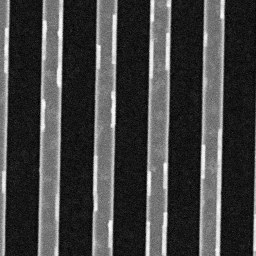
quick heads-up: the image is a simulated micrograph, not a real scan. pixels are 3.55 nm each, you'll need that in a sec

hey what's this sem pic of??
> parallel lines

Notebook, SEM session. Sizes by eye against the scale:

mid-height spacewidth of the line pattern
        0.12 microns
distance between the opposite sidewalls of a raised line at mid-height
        71.1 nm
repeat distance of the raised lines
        191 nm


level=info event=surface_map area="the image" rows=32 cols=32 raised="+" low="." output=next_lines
+....+++....+++....++.....++....
+....+++....+++....++.....++....
+....+++....++.....++.....++....
+....+++....++.....++.....++....
+....+++....++.....++.....++....
+....+++....++.....++....+++....
+....+++....++.....++....+++....
+....+++....++.....++....+++....
+....+++....++.....++....+++....
+....+++....++.....++....+++....
+....+++....++.....++....+++....
+....+++....++.....++....+++....
+....+++....++.....++....+++....
+....+++....++.....++....+++....
+....+++....++.....++....+++....
+....+++....++.....++....+++....
+....+++....++.....++....+++....
+....++.....++.....++....+++....
+....++.....++.....++....+++....
+....++.....++....+++....+++....
+....++.....++....+++....+++....
+....++.....++....+++....+++....
+....++.....++....+++....+++....
+....++.....++....+++....+++....
+....++.....++....+++....+++....
+....++.....++....+++....+++....
+....++.....++....+++....+++....
+....++.....++....+++....++.....
+....++.....++....+++....++.....
+....++.....++....+++....++.....
+....++.....++....+++....++.....
.....++.....++....+++....++.....